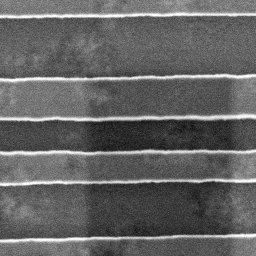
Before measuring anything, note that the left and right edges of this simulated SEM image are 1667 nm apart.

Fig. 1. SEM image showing lines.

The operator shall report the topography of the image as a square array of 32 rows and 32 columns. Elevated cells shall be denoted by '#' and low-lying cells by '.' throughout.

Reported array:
################################
################################
................................
................................
................................
................................
................................
................................
................................
...........................##.##
################################
################################
################################
################################
################################
................................
................................
................................
................................
################################
################################
################################
################################
................................
................................
................................
................................
................................
................................
......................##########
################################
################################